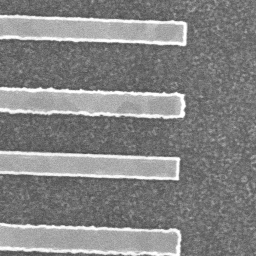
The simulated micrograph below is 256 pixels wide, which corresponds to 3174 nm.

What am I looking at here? one or a few lines or trenches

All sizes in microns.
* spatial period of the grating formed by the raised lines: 0.867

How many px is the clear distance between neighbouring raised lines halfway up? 50.7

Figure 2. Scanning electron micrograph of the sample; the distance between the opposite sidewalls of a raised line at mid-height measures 266 nm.